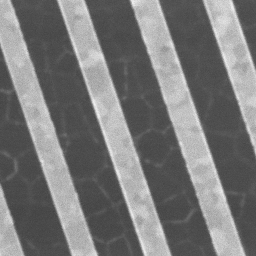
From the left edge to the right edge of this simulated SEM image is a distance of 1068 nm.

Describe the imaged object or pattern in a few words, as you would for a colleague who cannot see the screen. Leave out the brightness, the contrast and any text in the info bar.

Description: one or a few lines or trenches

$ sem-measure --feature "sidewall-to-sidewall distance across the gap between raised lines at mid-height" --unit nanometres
189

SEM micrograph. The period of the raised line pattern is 0.289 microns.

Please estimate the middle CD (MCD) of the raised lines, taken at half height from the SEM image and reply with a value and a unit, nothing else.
99.9 nm